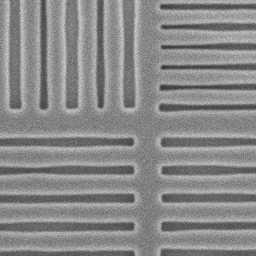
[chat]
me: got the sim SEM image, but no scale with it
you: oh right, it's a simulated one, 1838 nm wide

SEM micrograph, groups of lines, slits or small figures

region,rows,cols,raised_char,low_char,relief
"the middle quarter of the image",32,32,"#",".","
....####..#####...######........
....####..#####...#######..#####
....####..#####...##############
....####..#####...##############
....####..#####...##############
....####..#####...######........
....####..#####...######.....###
....####..#####...##############
....####..#####...##############
....####..#####...##############
....####..#####...######........
#.######################........
################################
################################
################################
################################
################################
################################
.................#######........
..................######........
.................#######........
################################
################################
################################
################################
.................########.......
..................######........
.................#######........
################################
################################
################################
################################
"